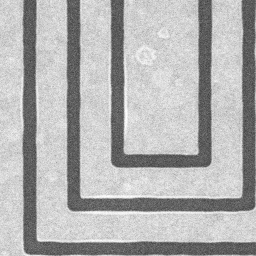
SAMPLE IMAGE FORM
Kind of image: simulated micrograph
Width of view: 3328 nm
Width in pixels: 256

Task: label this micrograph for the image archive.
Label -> groups of lines, slits or small figures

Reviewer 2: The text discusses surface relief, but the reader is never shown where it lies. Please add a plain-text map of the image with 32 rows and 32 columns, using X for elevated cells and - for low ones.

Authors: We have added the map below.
XXX--XXX--XXXX--XXXXXXXXX--XXX--
XXX--XXX--XXXX--XXXXXXXXX--XXX--
XXX--XXX--XXXX--XXXXXXXXX--XXX--
XXX--XXX--XXXX--XXXXXXXXX--XXX--
XXX--XXX--XXXX--XXXXXXXXX--XXX--
XXX--XXX--XXXX--XXXXXXXXX--XXX--
XXX--XXX--XXXX--XXXXXXXXX--XXX--
XXX--XXX--XXXX--XXXXXXXXX--XXX--
XXX--XXX--XXXX--XXXXXXXXX--XXX--
XXX--XXX--XXXX--XXXXXXXXX--XXX--
XXX--XXX--XXXX--XXXXXXXXX--XXX--
XXX--XXX--XXXX--XXXXXXXXX--XXX--
XXX--XXX--XXXX--XXXXXXXXX--XXX--
XXX--XXX--XXXX--XXXXXXXXX--XXX--
XXX--XXX--XXXX--XXXXXXXXX--XXX--
XXX--XXX--XXXX--XXXXXXXXX--XXX--
XXX--XXX--XXXX--XXXXXXXXX--XXX--
XXX--XXX--XXXX--XXXXXXXXX--XXX--
XXX--XXX--XXXX--XXXXXXXXX--XXX--
XXX--XXX--XXXX-------------XXX--
XXX--XXX--XXXX------------XXXX--
XXX--XXX--XXXXXXXXXXXXXXXXXXXX--
XXX--XXX--XXXXXXXXXXXXXXXXXXXX--
XXX--XXX--XXXXXXXXXXXXXXXXXXXX--
XXX--XXX--XXX------XXXXXXXXXXX--
XXX--XXX------------------------
XXX--XXXXX-------------------XXX
XXX--XXXXXXXXXXXXXXXXXXXXXXXXXXX
XXX--XXXXXXXXXXXXXXXXXXXXXXXXXXX
XXX--XXXXXXXXXXXXXXXXXXXXXXXXXXX
XXX-----------------------------
XXX-----------------------------